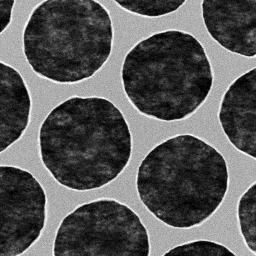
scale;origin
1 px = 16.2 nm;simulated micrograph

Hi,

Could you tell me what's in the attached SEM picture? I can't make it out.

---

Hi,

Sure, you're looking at holes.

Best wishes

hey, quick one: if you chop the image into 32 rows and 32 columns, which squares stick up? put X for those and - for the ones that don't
--XXX-------XXX--------XX-------
-XXX---------XXXX----XXXX-------
-XXX----------XXXXXXXXXXX-------
-XX-----------XXXXXXXXXXXX------
XXX-----------XXXXX-----XX------
XXX-----------XXX--------XXX----
XXX-----------XX----------XXX---
XXX----------XXX----------XXXXXX
--XX--------XXX-----------XXXXXX
---XX------XXXX------------XXX--
---XXXXXXXXXXXX-----------XXX---
---XXXXXXXXXXXXX----------XX----
----XXXX-----XXX----------XX----
----XXX--------XX--------XXX----
----XX---------XXXX----XXXX-----
---XX-----------XXXXXXXXXXXX----
---XX-----------XXXXXXXXXXXX----
--XXX-----------XXXXX----XXXX---
-XXXX-----------XXX--------XXX--
XXXXX-----------XX----------XXX-
XXXXXX----------XX----------XXXX
---XXX---------XX-----------XXXX
----XXX-------XXX-----------XXXX
-----XXXX---XXXXX-----------XXX-
------XXXXXXXXXXX-----------XX--
------XXXXX----XXX---------XXX--
------XXX--------XX--------XXX--
------XX---------XXX------XXXX--
-----XX-----------XXXXXXXXXXXX--
-----XX-----------XXXXXXXXXXXX--
----XXX------------XXXX----XXXX-
---XXXX------------XX--------XXX